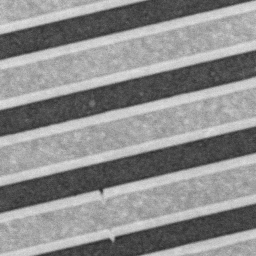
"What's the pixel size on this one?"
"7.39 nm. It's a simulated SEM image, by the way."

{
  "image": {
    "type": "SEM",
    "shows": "one or a few lines or trenches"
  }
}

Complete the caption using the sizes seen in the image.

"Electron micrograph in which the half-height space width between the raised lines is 0.275 um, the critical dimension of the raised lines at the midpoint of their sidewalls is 38 px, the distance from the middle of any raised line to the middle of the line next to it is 552 nanometres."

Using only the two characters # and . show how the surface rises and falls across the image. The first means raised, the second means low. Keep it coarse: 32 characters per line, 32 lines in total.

##############..................
#########...................####
#####...................########
#...................############
................################
...........#####################
.......#####################....
...#####################........
###################.............
###############.................
###########....................#
#######....................#####
###....................#########
..................##############
..............##################
..........####################..
......####################......
.#####################..........
#################...............
#############...................
#########....................###
#####....................#######
#....................###########
................################
.............###################
........#####################...
....#####################.......
#####################...........
################................
############...................#
########...................#####
####..................##########